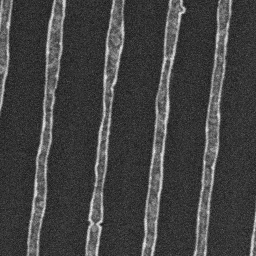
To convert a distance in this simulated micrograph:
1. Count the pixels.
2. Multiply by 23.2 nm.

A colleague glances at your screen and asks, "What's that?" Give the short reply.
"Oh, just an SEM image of parallel lines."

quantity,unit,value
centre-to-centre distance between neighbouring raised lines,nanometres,1280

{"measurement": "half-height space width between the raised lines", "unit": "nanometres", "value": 1030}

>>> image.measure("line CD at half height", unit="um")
0.233